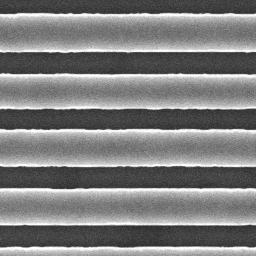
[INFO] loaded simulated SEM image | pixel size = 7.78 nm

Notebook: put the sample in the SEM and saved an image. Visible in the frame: lines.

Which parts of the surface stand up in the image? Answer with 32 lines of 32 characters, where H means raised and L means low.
LLLLLLLLLLLLLLLLLLLLLLLLLLLLLLLL
LLLLLLLLLLLLLLLLLLLLLLLLLLLLLLLL
HHHHHHHHHHHHHHHHHHHHHHHHHHHHHHHH
HHHHHHHHHHHHHHHHHHHHHHHHHHHHHHHH
HHHHHHHHHHHHHHHHHHHHHHHHHHHHHHHH
HHHHHHHHHHHHHHHHHHHHHHHHHHHHHHHH
LLLLLLLLLLLLLLLLLLLLLLLLLLLLLLLL
LLLLLLLLLLLLLLLLLLLLLLLLLLLLLLLL
LLLLLLLLLLLLLLLLLLLLLLLLLLLLLLLL
HHHHHHHHHHHHHHHHHHHHHHHHHHHHHHHH
HHHHHHHHHHHHHHHHHHHHHHHHHHHHHHHH
HHHHHHHHHHHHHHHHHHHHHHHHHHHHHHHH
HHHHHHHHHHHHHHHHHHHHHHHHHHHHHHHH
LLLLHLLHHLLLLLHLLLHHLLLHLLHHHHLL
LLLLLLLLLLLLLLLLLLLLLLLLLLLLLLLL
LLLLLLLLLLLLLLLLLLLLLLLLLLLLLLLL
HHHHHHHHHHHHHHHHHHHHHHHHHHHHHHHH
HHHHHHHHHHHHHHHHHHHHHHHHHHHHHHHH
HHHHHHHHHHHHHHHHHHHHHHHHHHHHHHHH
HHHHHHHHHHHHHHHHHHHHHHHHHHHHHHHH
HHHHHHHHHHHHHHHHHHHHHHHHHHHHHHHH
LLLLLLLLLLLLLLLLLLLLLLLLLLLLLLLL
LLLLLLLLLLLLLLLLLLLLLLLLLLLLLLLL
LLLLLLLLLLLLLLLLLLLLLLLLLLLLLLLL
HHHHHHHHHHHHHHHHHHHHHHHHHHHHHHHH
HHHHHHHHHHHHHHHHHHHHHHHHHHHHHHHH
HHHHHHHHHHHHHHHHHHHHHHHHHHHHHHHH
HHHHHHHHHHHHHHHHHHHHHHHHHHHHHHHH
LLLLLLLLLLLLLLLLLLLLLLLLLLLLLLLL
LLLLLLLLLLLLLLLLLLLLLLLLLLLLLLLL
LLLLLLLLLLLLLLLLLLLLLLLLLLLLLLLL
HHHHHHHHHHHHHHHHHHHHHHHHHHHHHHHH